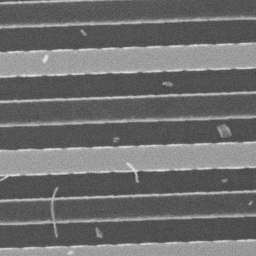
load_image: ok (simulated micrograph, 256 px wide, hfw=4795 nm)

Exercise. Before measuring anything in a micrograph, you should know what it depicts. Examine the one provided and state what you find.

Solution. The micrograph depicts lines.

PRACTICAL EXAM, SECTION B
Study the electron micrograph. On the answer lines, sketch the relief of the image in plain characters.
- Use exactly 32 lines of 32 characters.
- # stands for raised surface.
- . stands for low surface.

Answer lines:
################################
################################
######################..........
................................
................................
..............................##
....############################
################################
################################
####............................
................................
................................
.......#########################
################################
################################
#####...........................
................................
................................
...........#####################
################################
################################
###########.....#...............
................................
................................
................################
################################
################################
###############.................
................................
................................
.................###############
################################